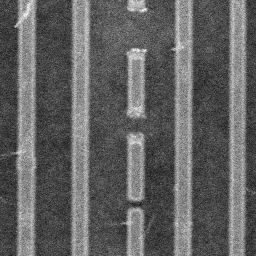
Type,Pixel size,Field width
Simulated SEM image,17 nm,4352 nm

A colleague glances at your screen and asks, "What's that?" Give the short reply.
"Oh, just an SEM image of parallel lines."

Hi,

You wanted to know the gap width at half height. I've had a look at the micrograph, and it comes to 0.68 microns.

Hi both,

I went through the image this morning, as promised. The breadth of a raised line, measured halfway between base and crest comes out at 14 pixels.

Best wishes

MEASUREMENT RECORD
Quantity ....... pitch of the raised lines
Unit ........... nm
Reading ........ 897